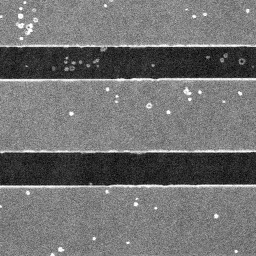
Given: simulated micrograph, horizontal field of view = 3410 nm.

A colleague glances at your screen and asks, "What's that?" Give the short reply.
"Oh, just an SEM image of lines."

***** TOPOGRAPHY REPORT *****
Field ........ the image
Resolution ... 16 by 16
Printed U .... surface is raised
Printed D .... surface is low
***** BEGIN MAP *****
UUUUUUUUUUUUUUUU
UUUUUUUUUUUUUUUU
UUUUUUUUUUUUUUUU
DDDDDDDDDDDDDDDD
DDDDDDDDDDDDDDDD
UUUUUUUUUUUUUUUU
UUUUUUUUUUUUUUUU
UUUUUUUUUUUUUUUU
UUUUUUUUUUUUUUUU
UDDDDDDDDDDDDDDD
DDDDDDDDDDDDDDDD
DDDDDDDDDDDDDDDD
UUUUUUUUUUUUUUUU
UUUUUUUUUUUUUUUU
UUUUUUUUUUUUUUUU
UUUUUUUUUUUUUUUU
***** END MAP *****